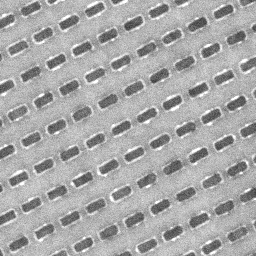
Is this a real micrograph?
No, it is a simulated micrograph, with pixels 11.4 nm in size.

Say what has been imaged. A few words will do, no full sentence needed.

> a regular array of raised bodies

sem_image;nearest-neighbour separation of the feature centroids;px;28.5